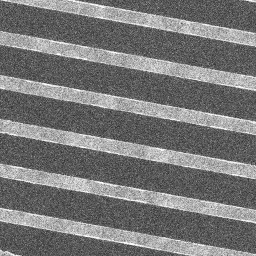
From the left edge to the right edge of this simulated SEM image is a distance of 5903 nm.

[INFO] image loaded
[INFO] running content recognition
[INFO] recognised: parallel lines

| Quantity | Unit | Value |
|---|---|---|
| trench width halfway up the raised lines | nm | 712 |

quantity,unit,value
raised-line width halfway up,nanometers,295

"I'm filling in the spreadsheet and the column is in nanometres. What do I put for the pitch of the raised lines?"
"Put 1000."